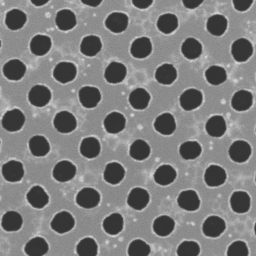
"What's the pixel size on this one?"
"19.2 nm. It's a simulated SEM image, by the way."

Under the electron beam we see a regular array of holes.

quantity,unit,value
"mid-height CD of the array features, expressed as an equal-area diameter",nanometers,424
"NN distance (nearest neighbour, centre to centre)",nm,675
